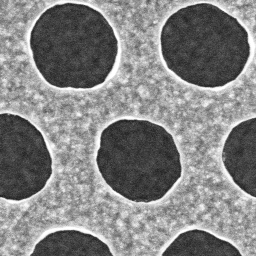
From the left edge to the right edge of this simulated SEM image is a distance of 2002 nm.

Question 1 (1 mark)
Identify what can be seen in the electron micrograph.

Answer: holes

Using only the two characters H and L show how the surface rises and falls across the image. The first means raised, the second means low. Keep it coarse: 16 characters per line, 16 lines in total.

HHHLLLHHHHHLLLHH
HHLLLLLHHHLLLLLH
HHLLLLLHHHLLLLLL
HHLLLLLHHHLLLLLL
HHLLLLLHHHHLLLLH
HHHHLLHHHHHHHHHH
HHHHHHHHHHHHHHHH
LLHHHHHLLHHHHHHL
LLLHHHLLLLLHHHLL
LLLHHHLLLLLHHHLL
LLLHHHLLLLLHHHLL
LLLHHHHLLLLHHHHL
HHHHHHHHLLHHHHHH
HHHHHHHHHHHHHHHH
HHHLLHHHHHHHLHHH
HHLLLLLHHHLLLLLH